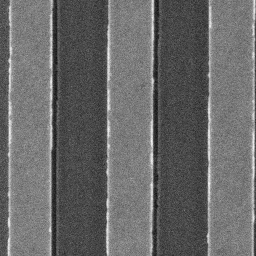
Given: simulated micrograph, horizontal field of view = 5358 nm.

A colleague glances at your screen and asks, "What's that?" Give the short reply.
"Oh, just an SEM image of lines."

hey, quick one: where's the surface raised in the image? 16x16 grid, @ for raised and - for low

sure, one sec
-@@----@@@---@@@
-@@----@@@---@@@
-@@----@@@---@@@
-@@----@@@---@@@
-@@----@@@---@@@
-@@----@@@---@@@
-@@----@@@---@@@
-@@----@@@---@@@
-@@----@@@---@@@
-@@----@@@---@@@
-@@----@@@---@@@
-@@----@@@---@@@
-@@----@@@---@@@
-@@----@@@---@@@
-@@----@@----@@@
-@@----@@----@@@